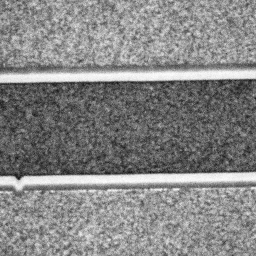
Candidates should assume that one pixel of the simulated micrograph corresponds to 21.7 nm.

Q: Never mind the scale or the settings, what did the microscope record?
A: one or a few lines or trenches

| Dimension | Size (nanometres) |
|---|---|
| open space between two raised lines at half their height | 2240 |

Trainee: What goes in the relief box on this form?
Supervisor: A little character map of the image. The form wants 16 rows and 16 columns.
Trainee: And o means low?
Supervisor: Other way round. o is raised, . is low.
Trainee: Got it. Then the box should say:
oooooooooooooooo
oooooooooooooooo
oooooooooooooooo
oooooooooooooooo
oooooooooooooooo
................
................
................
................
................
................
oooooooooooooooo
oooooooooooooooo
oooooooooooooooo
oooooooooooooooo
oooooooooooooooo